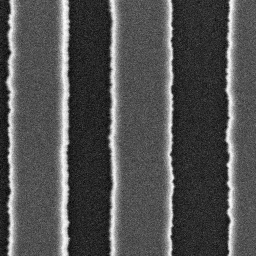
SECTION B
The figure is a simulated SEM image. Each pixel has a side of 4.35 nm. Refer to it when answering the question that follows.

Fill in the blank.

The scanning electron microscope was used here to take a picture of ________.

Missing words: lines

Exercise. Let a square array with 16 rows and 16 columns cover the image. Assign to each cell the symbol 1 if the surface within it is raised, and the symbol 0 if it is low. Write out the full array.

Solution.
0111000111100011
0111000111100011
0111000111100011
0111000111100011
0111000111100011
0111000111100011
0111000111100011
0111000111100011
0111000111100011
0111000111100011
0111000111100011
0111000111100011
0111000111100011
0111000111100011
0111000111100011
0111000111100011